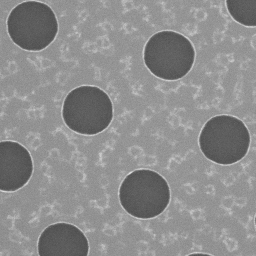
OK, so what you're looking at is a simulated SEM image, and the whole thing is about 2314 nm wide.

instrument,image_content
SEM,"holes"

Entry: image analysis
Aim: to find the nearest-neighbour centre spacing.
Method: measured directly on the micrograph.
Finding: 0.888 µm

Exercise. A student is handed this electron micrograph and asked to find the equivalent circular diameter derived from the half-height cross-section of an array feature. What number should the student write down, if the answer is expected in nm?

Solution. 455